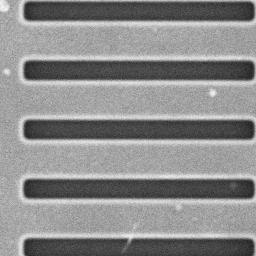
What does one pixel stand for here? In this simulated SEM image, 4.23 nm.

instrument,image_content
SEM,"groups of lines, slits or small figures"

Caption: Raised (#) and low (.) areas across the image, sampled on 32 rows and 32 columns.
###.............................
###.............................
###.............................
################################
################################
################################
################################
####...........................#
###.............................
###.............................
################################
################################
################################
################################
################################
###.............................
###.............................
####...........................#
################################
################################
################################
################################
###.............................
###.............................
###.............................
################################
################################
################################
################################
################################
###.............................
###.............................